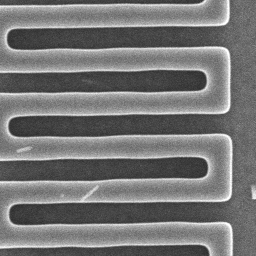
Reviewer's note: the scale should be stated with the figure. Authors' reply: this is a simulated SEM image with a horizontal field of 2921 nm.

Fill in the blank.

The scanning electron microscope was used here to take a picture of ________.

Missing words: groups of lines, slits or small figures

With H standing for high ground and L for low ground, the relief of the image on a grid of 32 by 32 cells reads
LLLLLLLLLLLLLLLLLLLLLLLLHHHHHLLL
HHHHHHHHHHHHHHHHHHHHHHHHHHHHHLLL
HHHHHHHHHHHHHHHHHHHHHHHHHHHHLLLL
HHHHLLLLLLLLLLLLLLLLLLLLLLLLLLLL
HLLLLLLLLLLLLLLLLLLLLLLLLLLLLLLL
HLLLLLLLLLLLLLLLLLLLLLLLLLLLLLLL
HHHHHHHHHHHHHHHHHHHHHHHHHHHHLLLL
HHHHHHHHHHHHHHHHHHHHHHHHHHHHHLLL
HHHHHHHHHHHHHHHHHHHHHHHHHHHHHLLL
LLLLLLLLLLLLLLLLLLLLLLLLLLHHHLLL
LLLLLLLLLLLLLLLLLLLLLLLLLLHHHLLL
LLLLLLLLLLLLLLLLLLLLLLLLHHHHHLLL
HHHHHHHHHHHHHHHHHHHHHHHHHHHHHLLL
HHHHHHHHHHHHHHHHHHHHHHHHHHHHHLLL
HHHLLLLLLLLLLLLLLLLLLLLLLLLLLLLL
HLLLLLLLLLLLLLLLLLLLLLLLLLLLLLLL
HLLLLLLLLLLLLLLLLLLLLLLLLLLLLLLL
HHHHHHHHHHHHHHHHHHHHHHHHHHHHHLLL
HHHHHHHHHHHHHHHHHHHHHHHHHHHHHLLL
HHHHHHHHHHHHHHHHHHHHHHHHHHHHHLLL
LLLLLLLLLLLLLLLLLLLLLLLLLLHHHLLL
LLLLLLLLLLLLLLLLLLLLLLLLLLHHHLLL
LLLLLLLLLLLLLLLLHHHHHHHHHHHHHLLL
HHHHHHHHHHHHHHHHHHHHHHHHHHHHHLLL
HHHHHHHHHHHHHHHHHHHHHHHHHHHHHLLL
HHLLLLLLLLLLLLLLLLLLLLLLLLLLLLLL
HLLLLLLLLLLLLLLLLLLLLLLLLLLLLLLL
HLLLLLLLLLLLLLLLLLLLLLLLLLLLLLLL
HHHHHHHHHHHHHHHHHHHHHHHHHHHHHLLL
HHHHHHHHHHHHHHHHHHHHHHHHHHHHHLLL
HHHHHHHHHHHHHHHHHHHHHHHHHHHHHLLL
LLLLLLLLLLLLLLLLLLLLLLLLLLHHHLLL